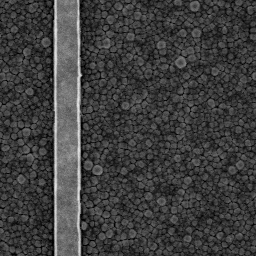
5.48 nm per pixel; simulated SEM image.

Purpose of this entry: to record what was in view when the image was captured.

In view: one or a few lines or trenches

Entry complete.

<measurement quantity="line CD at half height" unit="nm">130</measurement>